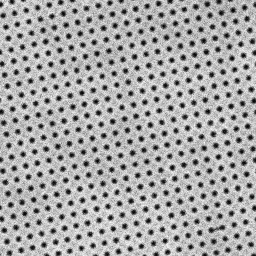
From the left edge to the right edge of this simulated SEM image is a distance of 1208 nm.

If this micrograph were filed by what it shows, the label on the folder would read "a regular array of holes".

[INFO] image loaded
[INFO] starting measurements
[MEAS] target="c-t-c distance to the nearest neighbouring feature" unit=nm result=54.4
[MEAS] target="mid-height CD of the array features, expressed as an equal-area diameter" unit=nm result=28.7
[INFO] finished